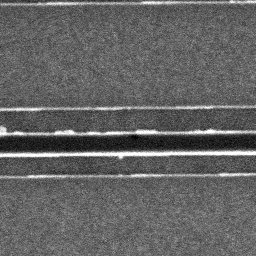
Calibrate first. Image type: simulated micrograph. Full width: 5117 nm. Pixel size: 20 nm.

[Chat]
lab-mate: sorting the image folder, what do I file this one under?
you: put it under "lines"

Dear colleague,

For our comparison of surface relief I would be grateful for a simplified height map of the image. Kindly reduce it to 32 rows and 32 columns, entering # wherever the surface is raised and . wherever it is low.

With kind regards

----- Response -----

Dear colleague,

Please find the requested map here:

......##########################
################################
################################
################################
################################
################################
################################
################################
################################
################################
################################
################################
################################
################................
................................
................................
.........................#######
################################
################################
................................
................................
................................
################################
################################
################################
################################
################################
################################
################################
################################
################################
################################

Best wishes